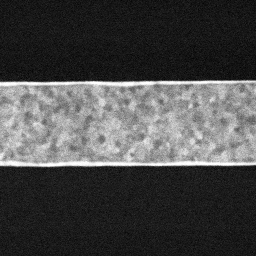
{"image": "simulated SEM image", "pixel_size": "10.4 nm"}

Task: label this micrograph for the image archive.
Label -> wiring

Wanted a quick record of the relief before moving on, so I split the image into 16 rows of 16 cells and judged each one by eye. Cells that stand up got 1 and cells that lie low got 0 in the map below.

0000000000000000
0000000000000000
0000000000000000
0000000000000000
0000000000000000
1111111111111111
1111111111111111
1111111111111111
1111111111111111
1111111111111111
0000000000000000
0000000000000000
0000000000000000
0000000000000000
0000000000000000
0000000000000000